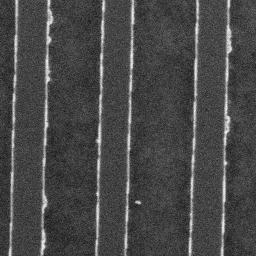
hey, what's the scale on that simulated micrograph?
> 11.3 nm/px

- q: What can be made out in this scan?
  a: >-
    lines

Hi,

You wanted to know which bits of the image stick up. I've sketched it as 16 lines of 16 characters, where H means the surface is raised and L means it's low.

LHHLLLHHLLLLHHLL
LHHLLLHHLLLLHHLL
LHHLLLHHLLLLHHLL
LHHLLLHHLLLLHHLL
LHHLLLHHLLLLHHLL
LHHLLLHHLLLLHHLL
LHHLLLHHLLLLHHLL
LHHLLLHHLLLLHHLL
LHHLLLHHLLLLHHLL
LHHLLLHHLLLLHHLL
LHHLLLHHLLLLHHLL
LHHLLLHHLLLLHHLL
LHHLLLHHLLLLHHLL
LHHLLLHHLLLLHHLL
LHHLLLHHLLLLHHLL
LHHLLLHHLLLLHHLL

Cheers